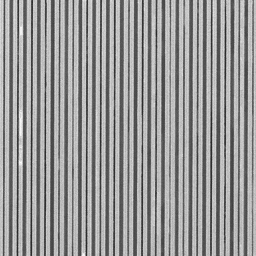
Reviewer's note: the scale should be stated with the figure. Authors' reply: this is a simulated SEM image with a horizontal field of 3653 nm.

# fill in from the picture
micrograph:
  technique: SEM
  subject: parallel lines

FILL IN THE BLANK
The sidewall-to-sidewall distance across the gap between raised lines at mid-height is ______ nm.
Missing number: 53.5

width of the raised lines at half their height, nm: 66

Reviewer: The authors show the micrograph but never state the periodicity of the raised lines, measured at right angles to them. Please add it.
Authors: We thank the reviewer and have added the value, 0.0991 microns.